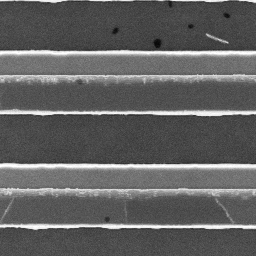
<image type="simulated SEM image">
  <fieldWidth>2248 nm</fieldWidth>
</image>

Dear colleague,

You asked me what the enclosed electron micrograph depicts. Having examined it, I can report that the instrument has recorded lines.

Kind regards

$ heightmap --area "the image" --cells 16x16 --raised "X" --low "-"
----------------
----------------
----------------
XXXXXXXXXXXXXXXX
XXXXXXXXXXXXXXXX
XXXXXXXXXXXXXXXX
XXXXXXXXXXXXXXXX
----------------
----------------
----------------
XXXXXXXXXXXXXXXX
XXXXXXXXXXXXXXXX
XXXXXXXXXXXXXXXX
XXXXXXXXXXXXXXXX
----------------
----------------